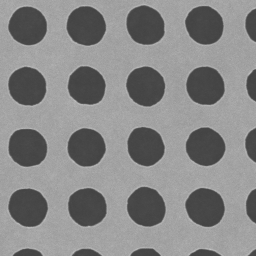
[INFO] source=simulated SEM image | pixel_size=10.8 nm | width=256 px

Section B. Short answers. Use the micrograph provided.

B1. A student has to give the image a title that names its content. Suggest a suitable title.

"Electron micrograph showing a regular array of holes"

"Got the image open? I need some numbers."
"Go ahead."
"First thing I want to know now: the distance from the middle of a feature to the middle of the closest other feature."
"640 nm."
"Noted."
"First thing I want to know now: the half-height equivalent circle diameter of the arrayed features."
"418 nm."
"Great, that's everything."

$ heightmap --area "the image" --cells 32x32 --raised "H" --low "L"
HHHHHHHHHHHHHHHHHHHHHHHHHHHHHHHH
HHLLLHHHHLLLHHHHLLLLHHHHLLLHHHHL
HLLLLLHHLLLLLHHHLLLLHHHLLLLLHHHL
HLLLLLHHLLLLLHHHLLLLLHHLLLLLHHHL
HHLLLLHHHLLLLHHHLLLLHHHHLLLLHHHL
HHHLHHHHHHLLHHHHHHLHHHHHHLLHHHHH
HHHHHHHHHHHHHHHHHHHHHHHHHHHHHHHH
HHHHHHHHHHHHHHHHHHHHHHHHHHHHHHHH
HHHLHHHHHHLLHHHHHLLHHHHHHLHHHHHH
HLLLLHHHHLLLLHHHLLLLHHHHLLLLHHHL
HLLLLLHHLLLLLHHHLLLLLHHLLLLLHHHL
HLLLLLHHHLLLLHHHLLLLLHHLLLLLHHHL
HHLLLHHHHLLLLHHHHLLLHHHHLLLHHHHH
HHHHHHHHHHHHHHHHHHHHHHHHHHHHHHHH
HHHHHHHHHHHHHHHHHHHHHHHHHHHHHHHH
HHHHHHHHHHHHHHHHHHHHHHHHHHHHHHHH
HHLLLHHHHLLLHHHHLLLLHHHHLLLHHHHL
HLLLLLHHHLLLLHHHLLLLHHHLLLLLHHHL
HLLLLLHHLLLLLHHHLLLLLHHLLLLLHHHL
HLLLLLHHHLLLLHHHLLLLHHHHLLLLHHHL
HHLLLHHHHHLLHHHHHLLHHHHHHLLHHHHH
HHHHHHHHHHHHHHHHHHHHHHHHHHHHHHHH
HHHHHHHHHHHHHHHHHHHHHHHHHHHHHHHH
HHHHHHHHHHHHHHHHHLLHHHHHHLHHHHHH
HLLLLHHHHLLLLHHHLLLLHHHHLLLLHHHL
HLLLLLHHHLLLLHHHLLLLLHHLLLLLHHHL
HLLLLLHHHLLLLHHHLLLLLHHLLLLLHHHL
HHLLLHHHHLLLLHHHHLLLHHHHLLLLHHHL
HHHHHHHHHHHHHHHHHHHHHHHHHHHHHHHH
HHHHHHHHHHHHHHHHHHHHHHHHHHHHHHHH
HHHHHHHHHHHHHHHHHHHHHHHHHHHHHHHH
HHLLLHHHHLLLHHHHHLLLHHHHLLLHHHHH